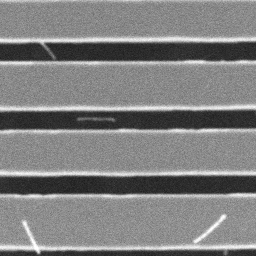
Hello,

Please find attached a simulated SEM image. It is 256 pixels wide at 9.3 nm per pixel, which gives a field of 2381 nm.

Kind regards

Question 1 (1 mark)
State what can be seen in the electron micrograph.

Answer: lines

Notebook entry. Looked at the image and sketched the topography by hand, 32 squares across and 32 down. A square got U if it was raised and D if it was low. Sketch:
UUUUUUUUUUUUUUUUUUUUUUUUUUUUUUUU
UUUUUUUUUUUUUUUUUUUUUUUUUUUUUUUU
UUUUUUUUUUUUUUUUUUUUUUUUUUUUUUUU
UUUUUUUUUUUUUUUUUUUUUUUUUUUUUUUU
UUUUUUUUUUUUUUUUUUUUUUUUUUUUUUUU
DDDDDDDDDDDDDDDDDDDDDDDDDDDDDDDD
DDDDDDDDDDDDDDDDDDDDDDDDDDDDDDDD
DDDDDDDDDDDDDDDDDDDDDDDDDDDDDDDD
UUUUUUUUUUUUUUUUUUUUUUUUUUUUUUUU
UUUUUUUUUUUUUUUUUUUUUUUUUUUUUUUU
UUUUUUUUUUUUUUUUUUUUUUUUUUUUUUUU
UUUUUUUUUUUUUUUUUUUUUUUUUUUUUUUU
UUUUUUUUUUUUUUUUUUUUUUUUUUUUUUUU
UUUUUUUUUUUUUUUUUUUUUUUUUUUUUUUU
DDDDDDDDDDDDDDDDDDDDDDDDDDDDDDDD
DDDDDDDDDDDDDDDDDDDDDDDDDDDDDDDD
UUUUUUUUUUUUUUUUUUUUUUUUUUUUUUUU
UUUUUUUUUUUUUUUUUUUUUUUUUUUUUUUU
UUUUUUUUUUUUUUUUUUUUUUUUUUUUUUUU
UUUUUUUUUUUUUUUUUUUUUUUUUUUUUUUU
UUUUUUUUUUUUUUUUUUUUUUUUUUUUUUUU
UUUUUUUUUUUUUUUUUUUUUUUUUUUUUUUU
DDDDDDDDDDDDDDDDDDDDDDDDDDDDDDDD
DDDDDDDDDDDDDDDDDDDDDDDDDDDDDDDD
UUUUUUUUUUUUUUUUUUUUUUUUUUUUUUUU
UUUUUUUUUUUUUUUUUUUUUUUUUUUUUUUU
UUUUUUUUUUUUUUUUUUUUUUUUUUUUUUUU
UUUUUUUUUUUUUUUUUUUUUUUUUUUUUUUU
UUUUUUUUUUUUUUUUUUUUUUUUUUUUUUUU
UUUUUUUUUUUUUUUUUUUUUUUUUUUUUUUU
UUUUUUUUUUUUUUUUUUUUUUUUUUUUUUUU
DDDDDDDDDDDDDDDDDDDDDDDDDDDDDDDD